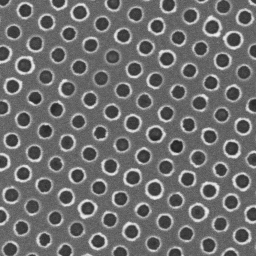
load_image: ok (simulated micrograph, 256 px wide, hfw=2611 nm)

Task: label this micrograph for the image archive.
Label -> a regular array of holes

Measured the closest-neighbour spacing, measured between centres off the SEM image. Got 245 nm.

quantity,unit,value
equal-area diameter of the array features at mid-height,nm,138